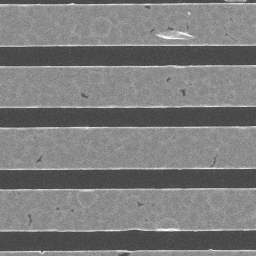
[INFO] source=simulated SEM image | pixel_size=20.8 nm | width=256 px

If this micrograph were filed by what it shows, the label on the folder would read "parallel lines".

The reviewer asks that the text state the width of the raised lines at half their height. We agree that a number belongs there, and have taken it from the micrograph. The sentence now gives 855 nanometers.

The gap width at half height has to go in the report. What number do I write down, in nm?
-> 408